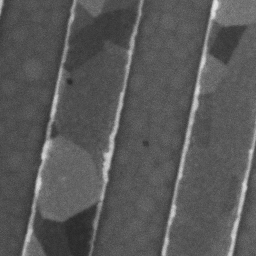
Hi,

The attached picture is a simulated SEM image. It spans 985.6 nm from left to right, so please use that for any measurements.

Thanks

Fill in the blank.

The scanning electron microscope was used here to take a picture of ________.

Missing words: one or a few lines or trenches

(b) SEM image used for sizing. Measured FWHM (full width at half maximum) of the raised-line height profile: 0.257 microns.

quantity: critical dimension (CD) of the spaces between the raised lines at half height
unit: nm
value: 268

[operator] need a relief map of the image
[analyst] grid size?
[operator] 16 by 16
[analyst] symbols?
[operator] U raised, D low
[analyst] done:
DDDDDUUUUDDDDUUU
DDDDUUUUUDDDDUUU
DDDDUUUUDDDDDUUU
DDDDUUUUDDDDDUUU
DDDDUUUUDDDDUUUU
DDDDUUUUDDDDUUUU
DDDUUUUUDDDDUUUU
DDDUUUUDDDDDUUUU
DDDUUUUDDDDDUUUU
DDDUUUUDDDDUUUUU
DDDUUUUDDDDUUUUU
DDUUUUUDDDDUUUUD
DDUUUUDDDDDUUUUD
DDUUUUDDDDDUUUUD
DDUUUUDDDDUUUUUD
DDUUUUDDDDUUUUUD